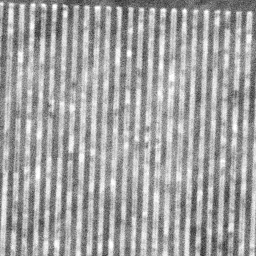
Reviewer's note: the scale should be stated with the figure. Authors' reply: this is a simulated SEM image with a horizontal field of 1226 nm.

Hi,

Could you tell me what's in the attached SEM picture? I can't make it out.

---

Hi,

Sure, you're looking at parallel lines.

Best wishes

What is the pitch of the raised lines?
51.9 nm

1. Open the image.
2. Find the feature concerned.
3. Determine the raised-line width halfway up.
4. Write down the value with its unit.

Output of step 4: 16.8 nm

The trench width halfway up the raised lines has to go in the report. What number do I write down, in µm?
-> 0.0377